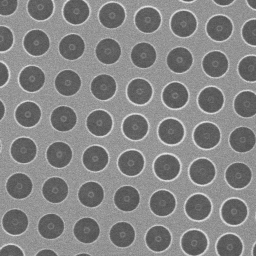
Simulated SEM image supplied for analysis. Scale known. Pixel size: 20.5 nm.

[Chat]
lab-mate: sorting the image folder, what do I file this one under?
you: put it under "an array of small figures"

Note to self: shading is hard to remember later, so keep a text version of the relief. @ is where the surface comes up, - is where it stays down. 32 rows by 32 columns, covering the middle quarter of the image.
@@@@@@@@@@@@@@@@@@----@@@@------
--@@@@@@@@@@@@@@@@@@@@@@@@@----@
---@@@@@@@-@@@@@@@@@@@@@@@@@@@@@
----@@@@----@@@@@@-@@@@@@@@@@@@@
----@@@------@@@-----@@@@@@--@@@
----@@@------@@@------@@@-----@@
----@@@------@@@------@@@------@
---@@@@------@@@------@@-------@
@@@@@@@@----@@@@------@@-------@
@@@@@@@@@@@@@@@@@----@@@@------@
-@@@@@@@@@@@@@@@@@@@@@@@@@----@@
--@@@@@@--@@@@@@@@@@@@@@@@@@@@@@
---@@@-----@@@@@@--@@@@@@@@@@@@@
---@@@------@@@-----@@@@@@--@@@@
---@@-------@@@------@@@-----@@@
---@@@------@@-------@@@------@@
--@@@@------@@-------@@-------@@
@@@@@@@----@@@@------@@-------@@
@@@@@@@@@@@@@@@@----@@@@------@@
@@@@@@@@@@@@@@@@@@@@@@@@@----@@@
-@@@@@@--@@@@@@@@@@@@@@@@@@@@@@@
--@@@-----@@@@@@--@@@@@@@@@@@@@@
--@@@------@@@-----@@@@@@--@@@@@
--@@-------@@@------@@@-----@@@@
--@@@------@@-------@@@------@@@
-@@@@------@@-------@@-------@@-
@@@@@@----@@@@------@@-------@@-
@@@@@@@@@@@@@@@----@@@@------@@-
@@@@@@@@@@@@@@@@@@@@@@@@----@@@-
@@@@@@--@@@@@@@@@@@@@@@@@@@@@@@@
-@@@-----@@@@@@--@@@@@@@@@@@@@@@
-@@@------@@@-----@@@@@@-@@@@@@@